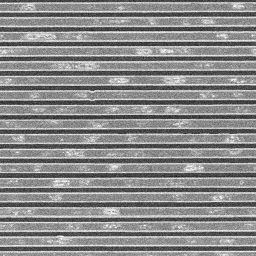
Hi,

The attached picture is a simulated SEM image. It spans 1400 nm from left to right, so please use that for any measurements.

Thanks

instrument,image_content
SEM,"parallel lines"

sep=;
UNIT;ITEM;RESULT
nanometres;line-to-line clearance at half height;30.1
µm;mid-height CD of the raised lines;0.0506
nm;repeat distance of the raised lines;80.1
